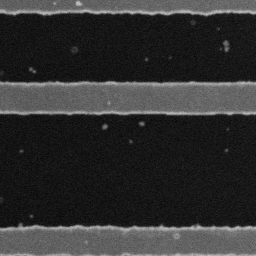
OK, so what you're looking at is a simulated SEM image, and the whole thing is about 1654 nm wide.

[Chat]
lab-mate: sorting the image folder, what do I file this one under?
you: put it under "lines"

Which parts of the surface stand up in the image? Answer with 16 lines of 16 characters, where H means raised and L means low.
HHHHHHHHHHHHHHHH
LLLLLLLLLLLLLLLL
LLLLLLLLLLLLLLLL
LLLLLLLLLLLLLLLL
LLLLLLLLLLLLLLLL
HHHHHHHHHHHHHHHH
HHHHHHHHHHHHHHHH
LLLLLLLLLLLLLLLL
LLLLLLLLLLLLLLLL
LLLLLLLLLLLLLLLL
LLLLLLLLLLLLLLLL
LLLLLLLLLLLLLLLL
LLLLLLLLLLLLLLLL
LLLLLLLLLLLLLLLL
HHHHHHHHHHHHHHHH
HHHHHHHHHHHHHHHH